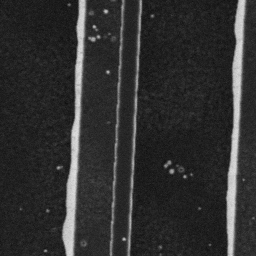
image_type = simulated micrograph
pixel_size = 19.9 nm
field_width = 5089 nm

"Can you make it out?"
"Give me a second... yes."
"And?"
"lines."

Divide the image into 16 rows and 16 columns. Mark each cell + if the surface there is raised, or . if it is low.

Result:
.....++++......+
.....++++......+
.....++++......+
.....++++......+
.....++++......+
.....++++......+
.....++++......+
.....+++.......+
.....+++.......+
.....+++.......+
.....+++.......+
.....+++.......+
....++++.......+
....++++......++
....++++......++
....++++......++